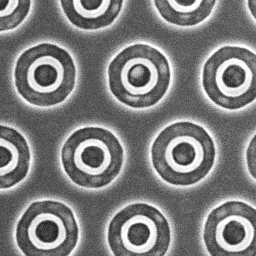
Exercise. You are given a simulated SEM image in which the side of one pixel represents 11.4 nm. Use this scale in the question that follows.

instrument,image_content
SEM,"ring-shaped grooves with a dot in the middle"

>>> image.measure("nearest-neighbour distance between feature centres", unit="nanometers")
1020